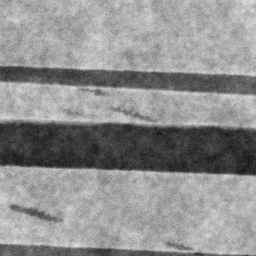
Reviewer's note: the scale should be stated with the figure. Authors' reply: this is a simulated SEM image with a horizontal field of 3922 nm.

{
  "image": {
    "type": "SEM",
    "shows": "lines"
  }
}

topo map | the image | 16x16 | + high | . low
++++++++++++++++
++++++++++++++++
++++++++++++++++
++++++++++++++++
++++++++++++++++
++++++++++++++++
++++++++++++++++
..++++++++++++++
................
................
+++.............
++++++++++++++++
++++++++++++++++
++++++++++++++++
++++++++++++++++
++++++++++++++++